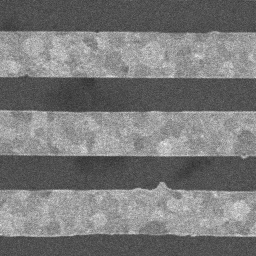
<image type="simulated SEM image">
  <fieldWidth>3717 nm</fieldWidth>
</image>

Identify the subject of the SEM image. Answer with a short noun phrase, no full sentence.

one or a few lines or trenches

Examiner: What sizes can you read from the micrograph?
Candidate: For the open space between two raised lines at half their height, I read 0.512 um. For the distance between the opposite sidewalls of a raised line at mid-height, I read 44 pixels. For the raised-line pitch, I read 1150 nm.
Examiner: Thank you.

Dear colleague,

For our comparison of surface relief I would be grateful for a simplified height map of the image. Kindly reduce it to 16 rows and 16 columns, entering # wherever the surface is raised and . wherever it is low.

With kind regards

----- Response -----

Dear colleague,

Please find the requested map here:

................
................
################
################
################
................
................
################
################
################
................
................
################
################
################
................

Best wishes